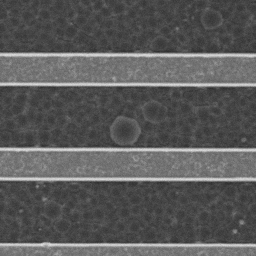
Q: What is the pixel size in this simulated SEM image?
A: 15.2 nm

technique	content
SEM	one or a few lines or trenches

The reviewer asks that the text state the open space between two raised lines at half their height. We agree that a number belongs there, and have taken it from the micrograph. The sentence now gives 991 nm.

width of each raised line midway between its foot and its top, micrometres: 0.447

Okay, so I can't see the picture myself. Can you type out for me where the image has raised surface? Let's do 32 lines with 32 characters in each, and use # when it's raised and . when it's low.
................................
................................
..........................#.....
................................
................................
................................
................................
################################
################################
################################
.###############################
................................
................................
...................#............
................................
..............###...............
..............###...............
...............#................
................................
################################
################################
################################
................................
................................
................................
................................
................................
................................
................................
................................
................................
################################